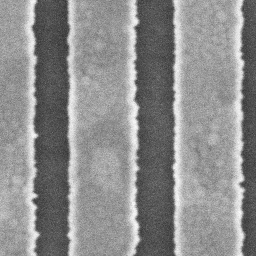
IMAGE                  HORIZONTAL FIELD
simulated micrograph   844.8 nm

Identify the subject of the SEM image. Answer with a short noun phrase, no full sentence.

lines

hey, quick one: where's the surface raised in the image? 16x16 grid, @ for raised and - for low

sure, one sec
@@--@@@@---@@@@-
@@--@@@@---@@@@-
@@--@@@@---@@@@-
@@--@@@@---@@@@-
@@--@@@@---@@@@-
@@--@@@@---@@@@-
@@--@@@@---@@@@-
@@--@@@@@--@@@@-
@@--@@@@@--@@@@-
@@--@@@@@--@@@@-
@@--@@@@---@@@@-
@@--@@@@---@@@@-
@@--@@@@---@@@@-
@@--@@@@---@@@@-
@@--@@@@@--@@@@-
@@--@@@@---@@@@-